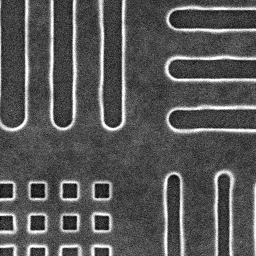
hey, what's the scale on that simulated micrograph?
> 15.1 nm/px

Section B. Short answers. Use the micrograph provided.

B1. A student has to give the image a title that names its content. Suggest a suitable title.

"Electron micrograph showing groups of lines, slits or small figures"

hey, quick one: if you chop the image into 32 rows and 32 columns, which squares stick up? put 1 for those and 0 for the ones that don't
00011110011110011111111111111111
00011110011110011111110000000000
00011110011110011111100000000000
00011110011110011111110000000000
00011110011110011111111111111111
00011110011110011111111111111111
00011110011110011111111111111111
00011110011110011111110000000000
00011110011110011111100000000000
00011100011110011111100000000000
00011100011110011111111111111111
00011110011110011111111111111111
00011110011110011111111111111111
00011110011110011111111111111001
00011110011110011111100000000000
00011110011110011111100000000000
11111111111111111111111111111111
11111111111111111111111111111111
11111111111111111111111111111111
11111111111111111111111111111111
11111111111111111111111111111111
11111111111111111111111111111111
11111111111111111111100111100111
00110011001100111111100111100111
00110111001100111111100111100111
11111111111111111111100111100111
11111111111111111111100111100111
00110011001100111111100111100111
00110011001100111111100111100111
11111111111111111111100111100111
11111111111111111111100111100111
00110011001100111111100111100111